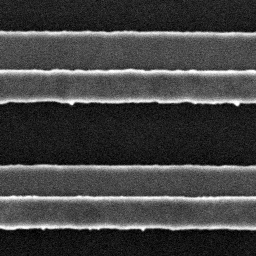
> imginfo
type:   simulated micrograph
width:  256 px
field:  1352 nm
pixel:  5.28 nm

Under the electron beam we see lines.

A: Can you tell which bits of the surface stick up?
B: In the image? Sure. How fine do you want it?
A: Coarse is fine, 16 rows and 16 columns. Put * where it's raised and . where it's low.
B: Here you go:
................
................
****************
****************
****************
****************
................
................
................
................
****************
****************
****************
****************
................
................